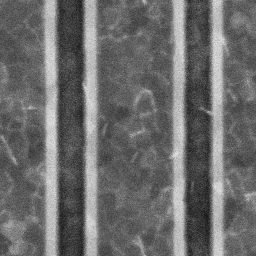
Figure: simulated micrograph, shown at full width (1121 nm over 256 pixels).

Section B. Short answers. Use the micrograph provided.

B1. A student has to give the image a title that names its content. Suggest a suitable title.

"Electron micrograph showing one or a few lines or trenches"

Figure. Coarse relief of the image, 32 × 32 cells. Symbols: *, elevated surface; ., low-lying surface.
******.....***********.....*****
******.....***********.....*****
******.....***********.....*****
******.....***********.....*****
******.....***********.....*****
******.....***********.....*****
******.....***********.....*****
******.....***********.....*****
******.....***********.....*****
******.....***********.....*****
******.....***********.....*****
******.....***********.....*****
******.....***********.....*****
******.....***********.....*****
******.....***********.....*****
******.....***********.....*****
******.....***********.....*****
******.....***********.....*****
******.....***********.....*****
******.....***********.....*****
******.....***********.....*****
******.....***********.....*****
******......**********.....*****
******......**********.....*****
******......**********.....*****
******......**********.....*****
******......**********.....*****
******......**********.....*****
******......**********.....*****
******......**********.....*****
******......**********.....*****
******......**********.....*****